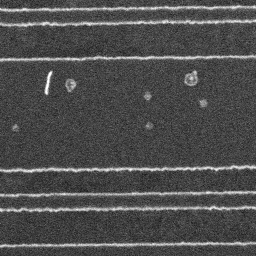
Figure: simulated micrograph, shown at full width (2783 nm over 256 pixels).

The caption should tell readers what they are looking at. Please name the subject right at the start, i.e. lines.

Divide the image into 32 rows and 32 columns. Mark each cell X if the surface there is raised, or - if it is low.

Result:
--------------------------------
XXXXXXXXXXXXXXXXXXXXXXXXXXXXXXXX
XXXXXXXXXXXXXXXXXXXXXXXXXXXXXXXX
--------------------------------
--------------------------------
--------------------------------
--------------------------------
XXXXXXXXXXXXXXXXXXXXXXXXXXXXXXXX
XXXXXXXXXXXXXXXXXXXXXXXXXXXXXXXX
XXXXXXXXXXXXXXXXXXXXXXXXXXXXXXXX
XXXXXXXXXXXXXXXXXXXXXXXXXXXXXXXX
XXXXXXXXXXXXXXXXXXXXXXXXXXXXXXXX
XXXXXXXXXXXXXXXXXXXXXXXXXXXXXXXX
XXXXXXXXXXXXXXXXXXXXXXXXXXXXXXXX
XXXXXXXXXXXXXXXXXXXXXXXXXXXXXXXX
XXXXXXXXXXXXXXXXXXXXXXXXXXXXXXXX
XXXXXXXXXXXXXXXXXXXXXXXXXXXXXXXX
XXXXXXXXXXXXXXXXXXXXXXXXXXXXXXXX
XXXXXXXXXXXXXXXXXXXXXXXXXXXXXXXX
XXXXXXXXXXXXXXXXXXXXXXXXXXXXXXXX
XXXXXXXXXXXXXXXXXXXXXXXXXXXXXXXX
--------------------------------
--------------------------------
--------------------------------
XXXXXXXXXXXXXXXXXXXXXXXXXXXXXXXX
XXXXXXXXXXXXXXXXXXXXXXXXXXXXXXXX
--------------------------------
--------------------------------
--------------------------------
--------------------------------
-------------------X--XXXXXXXXXX
XXXXXXXXXXXXXXXXXXXXXXXXXXXXXXXX